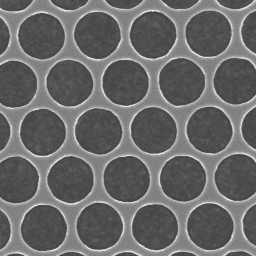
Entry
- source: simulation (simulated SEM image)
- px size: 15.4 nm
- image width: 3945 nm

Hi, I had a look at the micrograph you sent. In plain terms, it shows a regular array of holes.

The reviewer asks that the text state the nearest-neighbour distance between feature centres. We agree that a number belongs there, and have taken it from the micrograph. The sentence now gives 850 nm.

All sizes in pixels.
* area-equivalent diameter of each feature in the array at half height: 46.8